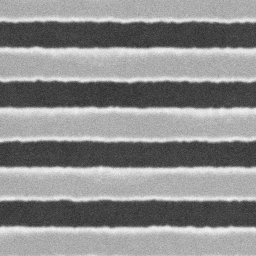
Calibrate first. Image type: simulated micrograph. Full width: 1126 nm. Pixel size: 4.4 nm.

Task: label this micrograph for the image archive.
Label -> lines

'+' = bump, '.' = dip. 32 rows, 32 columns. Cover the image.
++++++++++++++++++++++++++++++++
++++++++++++++++++++++++++++++++
++++++++++++++++++++++++++++++++
................................
................................
................................
++++++++++++++++++++++++++++++++
++++++++++++++++++++++++++++++++
++++++++++++++++++++++++++++++++
++++++++++++++++++++++++++++++++
................................
................................
................................
................................
++++++++++++++++++++++++++++++++
++++++++++++++++++++++++++++++++
++++++++++++++++++++++++++++++++
+++++..+.+++++++++++++++++++++++
................................
................................
................................
++++++++++++++++++++++++++++++++
++++++++++++++++++++++++++++++++
++++++++++++++++++++++++++++++++
++++++++++++++++++++++++++++++++
................................
................................
................................
+++++++++.++++.++.++++++.+..++++
++++++++++++++++++++++++++++++++
++++++++++++++++++++++++++++++++
++++++++++++++++++++++++++++++++